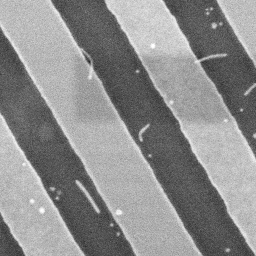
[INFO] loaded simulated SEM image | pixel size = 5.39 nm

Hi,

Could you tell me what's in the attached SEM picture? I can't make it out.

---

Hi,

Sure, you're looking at lines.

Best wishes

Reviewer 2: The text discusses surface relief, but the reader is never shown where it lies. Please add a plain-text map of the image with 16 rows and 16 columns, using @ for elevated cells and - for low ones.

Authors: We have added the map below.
@@@----@@@----@@
@@@@---@@@@---@@
-@@@@---@@@@---@
-@@@@----@@@----
--@@@@---@@@@---
--@@@@----@@@---
---@@@@---@@@@--
----@@@@---@@@@-
@---@@@@----@@@-
@----@@@@---@@@@
@@---@@@@----@@@
@@@---@@@@---@@@
@@@---@@@@@---@@
@@@@---@@@@---@@
-@@@----@@@@---@
-@@@@---@@@@----